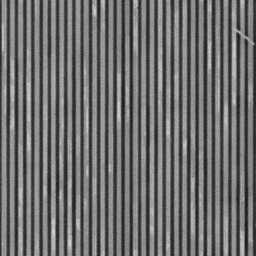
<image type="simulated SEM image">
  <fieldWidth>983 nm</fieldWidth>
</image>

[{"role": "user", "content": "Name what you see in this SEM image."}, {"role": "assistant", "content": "parallel lines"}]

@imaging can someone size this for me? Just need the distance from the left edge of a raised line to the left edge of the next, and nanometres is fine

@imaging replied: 31.5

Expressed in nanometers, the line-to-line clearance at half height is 16.3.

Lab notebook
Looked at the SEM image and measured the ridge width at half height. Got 16.3 nanometres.